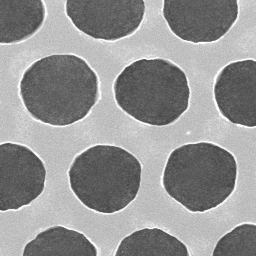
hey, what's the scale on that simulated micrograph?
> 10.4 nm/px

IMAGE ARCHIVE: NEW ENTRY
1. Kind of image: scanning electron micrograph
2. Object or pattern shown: holes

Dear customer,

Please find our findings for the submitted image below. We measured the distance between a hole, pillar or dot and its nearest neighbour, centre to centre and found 0.977 µm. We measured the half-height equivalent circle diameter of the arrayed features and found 736 nm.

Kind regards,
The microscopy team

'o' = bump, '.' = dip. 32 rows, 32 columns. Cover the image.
.....ooo..........ooo.........oo
......oo..........oo..........oo
.....oooo.........ooo........ooo
.....ooooo.......oooo........ooo
....ooooooo.....oooooo......oooo
oooooooooooooooooooooooooooooooo
oooooooooooooooooooooooooooooooo
ooooo.....ooooooo...oooooooooo..
oooo.......ooooo......oooooo....
ooo.........ooo........oooo.....
ooo.........oo..........ooo.....
ooo.........oo..........ooo.....
ooo.........ooo.........ooo.....
ooo........oooo........oooo.....
oooo.......ooooo......oooooo....
oooooo...oooooooooo..ooooooooo..
oooooooooooooooooooooooooooooooo
oooooooooooooooooooooooooooooooo
...oooooooo....ooooooo......oooo
.....ooooo.......oooo........ooo
.....oooo........oooo.........oo
......ooo.........oo..........oo
......ooo.........oo.........ooo
.....oooo........oooo........ooo
.....ooooo.......oooo........ooo
...ooooooo......ooooooo....ooooo
oooooooooooo..oooooooooooooooooo
oooooooooooooooooooooooooooooooo
oooooo..ooooooooooooooooooooo...
ooooo......ooooo......oooooo....
ooo.........ooo........oooo.....
ooo.........oo.........oooo.....